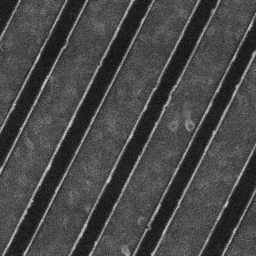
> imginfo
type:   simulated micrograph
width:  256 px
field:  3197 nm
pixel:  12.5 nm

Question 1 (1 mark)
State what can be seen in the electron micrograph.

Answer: parallel lines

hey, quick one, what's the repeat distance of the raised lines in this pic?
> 58.4 px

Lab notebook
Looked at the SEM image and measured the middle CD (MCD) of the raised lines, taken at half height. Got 246 nm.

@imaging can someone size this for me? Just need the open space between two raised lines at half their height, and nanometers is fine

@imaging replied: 493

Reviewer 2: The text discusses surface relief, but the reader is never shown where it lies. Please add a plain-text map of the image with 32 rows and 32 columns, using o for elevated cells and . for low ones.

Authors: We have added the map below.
oo......ooo.....ooo......oo.....
oo......oo......oo......ooo.....
o......ooo.....ooo......oo......
o......oo......oo......ooo.....o
......ooo.....ooo......oo......o
......oo......oo......ooo.....oo
.....ooo.....ooo......oo......oo
.....oo......oo......ooo.....ooo
....ooo.....ooo......oo......oo.
....oo......oo......ooo.....ooo.
...ooo.....ooo......oo......oo..
...oo......oo......ooo.....oo...
..ooo.....ooo......oo......oo...
..oo......oo......ooo.....oo....
.ooo.....ooo......oo......oo....
ooo......oo......ooo.....oo.....
ooo.....ooo.....ooo......oo.....
oo......oo......ooo.....oo......
oo.....ooo.....ooo.....ooo......
o......oo......ooo.....oo......o
o.....ooo.....ooo.....ooo......o
......oo......ooo.....oo......oo
.....ooo.....ooo.....ooo......oo
.....oo......ooo.....oo......ooo
....ooo.....ooo.....ooo......ooo
....oo......ooo.....oo......ooo.
...ooo.....ooo.....ooo......ooo.
...oo......ooo.....oo......ooo..
..ooo.....ooo......oo......ooo..
..oo......ooo.....oo......ooo...
.ooo.....ooo.....ooo......ooo...
.oo......ooo.....oo......ooo....